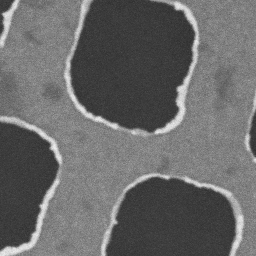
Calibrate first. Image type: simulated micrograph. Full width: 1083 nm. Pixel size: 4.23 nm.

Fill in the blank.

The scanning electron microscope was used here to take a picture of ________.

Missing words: holes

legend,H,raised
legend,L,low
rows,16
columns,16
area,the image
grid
LHHHHLLLLLLHHHHH
HHHHHLLLLLLLHHHH
HHHHHLLLLLLLHHHH
HHHHHLLLLLLLHHHH
HHHHLLLLLLLLHHHH
HHHHLLLLLLLHHHHH
HHHHHLLLLLLHHHHH
HHHHHHHLLLLHHHHH
LLLHHHHHHHHHHHHH
LLLHHHHHHHHHHHHH
LLLLHHHHHHHHHHHH
LLLHHHHHHLLLHHHH
LLLHHHHHLLLLLLHH
LLHHHHHLLLLLLLLH
LLHHHHHLLLLLLLLH
HHHHHHHLLLLLLLHH